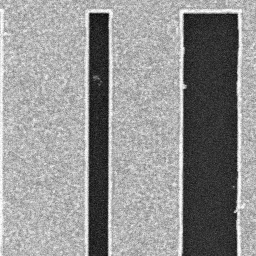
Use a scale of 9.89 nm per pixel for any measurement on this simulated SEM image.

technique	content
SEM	one or a few lines or trenches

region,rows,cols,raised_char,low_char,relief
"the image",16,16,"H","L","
HHHHHHHHHHHHHHHH
HHHHHLLHHHHLLLLH
HHHHHLLHHHHLLLLH
HHHHHLLHHHHLLLLH
HHHHHLLHHHHLLLLH
HHHHHLLHHHHLLLLH
HHHHHLLHHHHLLLLH
HHHHHLLHHHHLLLLH
HHHHHLLHHHHLLLLH
HHHHHLLHHHHLLLLH
HHHHHLLHHHHLLLLH
HHHHHLLHHHHLLLLH
HHHHHLLHHHHLLLLH
HHHHHLLHHHHLLLLH
HHHHHLLHHHHLLLLH
HHHHHLLHHHHLLLLH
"